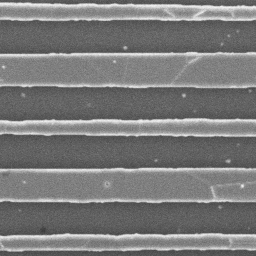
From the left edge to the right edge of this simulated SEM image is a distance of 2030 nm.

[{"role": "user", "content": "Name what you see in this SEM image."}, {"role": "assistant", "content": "lines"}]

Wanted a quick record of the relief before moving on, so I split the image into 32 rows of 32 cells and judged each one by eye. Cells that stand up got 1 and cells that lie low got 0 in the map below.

11010000000000000000000000000000
11111111111111111111111111111111
01110111111111000000111111011111
00000000000000000000000000000000
00000000000000000000000000000000
00000000000000000000000000000000
00000000000000000000000000000000
11111111111111111111111111111111
11111111111111111111111111111111
11111111111111111111111111111111
11111111111111111111111111111111
00000000000000000000000000000000
00000000000000000000000000000000
00000000000000000000000000000000
00000000000000000000000000000000
11111111111111111111111111111111
11111111111111111111111111111111
00000000000000000000000000000000
00000000000000000000000000000000
00000000000000000000000000000000
00000000000000000000000000000000
11111111111111111111111111111111
11111111111111111111111111111111
11111111111111111111111111111111
11111111111111111111111111111111
00000000000000000000000000000000
00000000000000000000000000000000
00000000000000000000000000000000
00000000000000000000000000000000
01111111111111111111111111111111
11111111111111111111111111111111
00000000000000000000000000000000